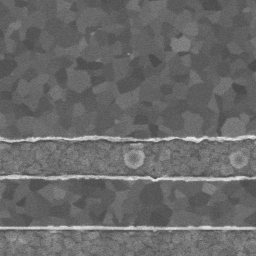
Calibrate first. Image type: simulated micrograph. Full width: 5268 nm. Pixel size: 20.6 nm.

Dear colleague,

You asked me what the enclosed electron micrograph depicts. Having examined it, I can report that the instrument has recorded one or a few lines or trenches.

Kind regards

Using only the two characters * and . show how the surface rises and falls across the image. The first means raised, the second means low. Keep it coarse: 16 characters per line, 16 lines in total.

****************
****************
****************
****************
****************
****************
****************
****************
****************
................
................
****************
****************
****************
................
................